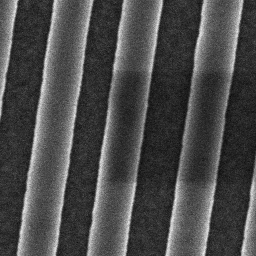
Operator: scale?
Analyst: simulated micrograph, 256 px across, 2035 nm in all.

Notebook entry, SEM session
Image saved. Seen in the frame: lines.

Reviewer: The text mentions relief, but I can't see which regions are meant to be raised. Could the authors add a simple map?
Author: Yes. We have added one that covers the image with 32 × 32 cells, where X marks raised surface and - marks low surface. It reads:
XX-----XXXXX---XXXXX-----XXXXX--
XX-----XXXX----XXXXX-----XXXXX--
XX----XXXXX----XXXXX-----XXXXX--
XX----XXXXX----XXXXX-----XXXXX--
XX----XXXXX----XXXXX-----XXXXX--
X-----XXXXX----XXXX------XXXXX--
X-----XXXXX----XXXX-----XXXXX---
X-----XXXXX---XXXXX-----XXXXX---
X----XXXXX----XXXXX-----XXXXX---
X----XXXXX----XXXXX-----XXXXX---
X----XXXXX----XXXXX-----XXXXX---
-----XXXXX----XXXXX-----XXXXX---
-----XXXXX----XXXXX-----XXXX----
-----XXXXX----XXXX------XXXX----
-----XXXX----XXXXX-----XXXXX----
-----XXXX----XXXXX-----XXXXX----
----XXXXX----XXXXX-----XXXXX----
----XXXXX----XXXXX-----XXXXX----
----XXXXX----XXXXX-----XXXXX----
----XXXXX----XXXX------XXXX-----
----XXXXX---XXXXX-----XXXXX-----
----XXXX----XXXXX-----XXXXX-----
----XXXX----XXXXX-----XXXXX-----
---XXXXX----XXXXX-----XXXXX----X
---XXXXX----XXXXX-----XXXXX----X
---XXXXX----XXXXX-----XXXXX----X
---XXXXX----XXXX------XXXX-----X
---XXXXX----XXXX-----XXXXX-----X
---XXXX----XXXXX-----XXXXX-----X
---XXXX----XXXXX-----XXXXX-----X
--XXXXX----XXXXX-----XXXXX----XX
--XXXXX----XXXXX-----XXXXX----XX